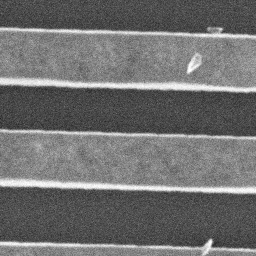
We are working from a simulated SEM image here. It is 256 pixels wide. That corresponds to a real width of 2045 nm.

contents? lines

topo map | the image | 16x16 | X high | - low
----------------
----------------
XXXXXXXXXXXXXXXX
XXXXXXXXXXXXXXXX
XXXXXXXXXXXXXXXX
-----------XXXXX
----------------
----------------
XXXXXXXXXXXXX---
XXXXXXXXXXXXXXXX
XXXXXXXXXXXXXXXX
XXXXXXXXXXXXXXXX
----------------
----------------
----------------
XXXXXXXXXXXXXX--